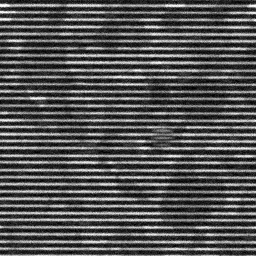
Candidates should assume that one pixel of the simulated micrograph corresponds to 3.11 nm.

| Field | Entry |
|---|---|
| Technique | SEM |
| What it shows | parallel lines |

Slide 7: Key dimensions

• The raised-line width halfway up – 5.8 nm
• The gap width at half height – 17.1 nanometers